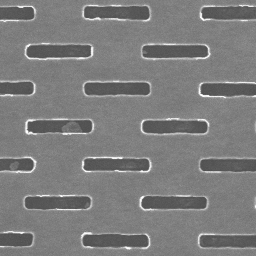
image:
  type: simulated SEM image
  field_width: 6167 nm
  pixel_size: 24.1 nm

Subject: a regular array of holes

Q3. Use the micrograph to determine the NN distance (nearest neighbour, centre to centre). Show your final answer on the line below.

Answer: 1.67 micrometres